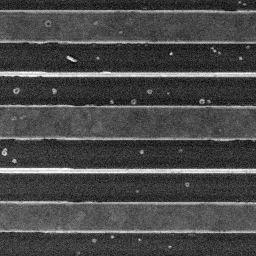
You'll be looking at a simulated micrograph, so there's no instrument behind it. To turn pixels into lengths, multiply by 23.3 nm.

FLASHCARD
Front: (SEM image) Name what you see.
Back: lines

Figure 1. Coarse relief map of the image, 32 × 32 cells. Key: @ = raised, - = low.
--------------------------------
@@@@@@@@@@@@@@@@@@@@@@@@@@@@@@@@
@@@@@@@@@@@@@@@@@@@@@@@@@@@@@@@@
@@@@@@@@@@@@@@@@@@@@@@@@@@@@@@@@
@@@@@@@@@@@@@@@@@@@@@@@@@@@@@@@@
--------------------------------
--------------------------------
--------------------------------
--------------------------------
--------------------------------
--------------------------------
--------------------------------
--------------------------------
@@@@@@@@@@@@@@@@@@@@@@@@@@@@@@@@
@@@@@@@@@@@@@@@@@@@@@@@@@@@@@@@@
@@@@@@@@@@@@@@@@@@@@@@@@@@@@@@@@
@@@@@@@@@@@@@@@@@@@@@@@@@@@@@@@@
--------------------------------
--------------------------------
--------------------------------
--------------------------------
--------------------------------
--------------------------------
--------------------------------
--------------------------------
@@@@@@@@@@@@@@@@@@@@@@@@@@@@@@@@
@@@@@@@@@@@@@@@@@@@@@@@@@@@@@@@@
@@@@@@@@@@@@@@@@@@@@@@@@@@@@@@@@
@@@@@@@@@@@@@@@@@@@@@@@@@@@@@@@@
--------------------------------
--------------------------------
--------------------------------